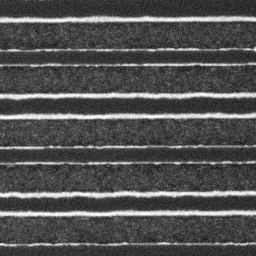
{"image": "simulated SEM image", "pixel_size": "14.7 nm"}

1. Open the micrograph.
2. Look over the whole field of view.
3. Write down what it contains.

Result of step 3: lines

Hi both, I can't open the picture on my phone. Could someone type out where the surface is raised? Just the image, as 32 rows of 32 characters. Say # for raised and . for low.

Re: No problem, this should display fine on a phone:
################################
################################
##################.######......#
................................
................................
................................
################################
################################
................................
................................
................................
................................
################################
################################
##########################.#####
................................
................................
................................
################################
################################
................................
................................
................................
................................
################################
################################
################################
................................
................................
................................
...............#...##......#..##
################################